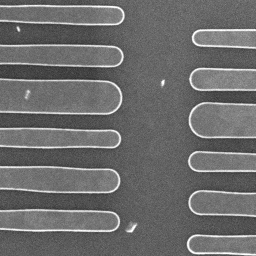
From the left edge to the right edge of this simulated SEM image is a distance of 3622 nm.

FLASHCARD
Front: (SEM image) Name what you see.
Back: groups of lines, slits or small figures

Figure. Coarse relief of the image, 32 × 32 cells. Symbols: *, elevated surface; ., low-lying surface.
................................
***************.................
***************.................
................................
........................********
.........................*******
***************.................
***************.................
................................
........................********
**************..........********
***************.................
***************.................
***************.........********
........................********
........................********
**************..........********
***************.................
................................
........................********
........................********
**************..................
***************.................
***************.................
........................********
........................********
*************...........********
***************.................
***************.................
........................**......
........................********
........................********